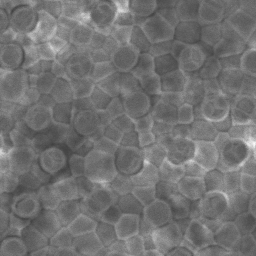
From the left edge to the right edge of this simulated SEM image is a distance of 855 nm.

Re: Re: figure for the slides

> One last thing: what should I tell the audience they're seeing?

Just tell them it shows a regular array of raised bodies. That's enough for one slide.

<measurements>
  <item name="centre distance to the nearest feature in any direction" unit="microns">0.1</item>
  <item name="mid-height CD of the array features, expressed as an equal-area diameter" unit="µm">0.0777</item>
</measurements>